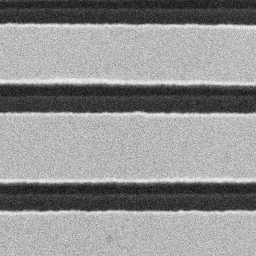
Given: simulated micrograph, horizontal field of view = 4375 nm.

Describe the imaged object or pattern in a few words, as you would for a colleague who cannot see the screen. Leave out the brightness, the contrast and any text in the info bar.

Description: lines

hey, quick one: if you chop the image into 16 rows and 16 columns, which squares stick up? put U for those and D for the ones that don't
DDDDDDDDDDDDDDDD
UUUUUUUUDUDDDDDD
UUUUUUUUUUUUUUUU
UUUUUUUUUUUUUUUU
UUUUUUUUUUUUUUUU
DDDDDDDDDDDDDDDD
DDDDDDDDDDDDDDDD
UUUUUUUUUUUUUUUU
UUUUUUUUUUUUUUUU
UUUUUUUUUUUUUUUU
UUUUUUUUUUUUUUUU
DDDDDDDDDDDDDDDD
DDDDDDDDDDDDDDDD
UUUUUUUUUUUUUUUU
UUUUUUUUUUUUUUUU
UUUUUUUUUUUUUUUU